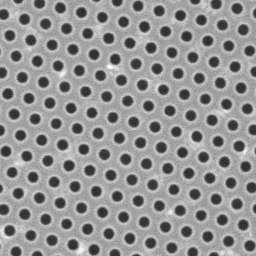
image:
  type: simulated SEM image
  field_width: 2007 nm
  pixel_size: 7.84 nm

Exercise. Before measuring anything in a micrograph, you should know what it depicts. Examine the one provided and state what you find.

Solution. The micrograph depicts a regular array of holes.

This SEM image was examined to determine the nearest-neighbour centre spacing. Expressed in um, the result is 0.168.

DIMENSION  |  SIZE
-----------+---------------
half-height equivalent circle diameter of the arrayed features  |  86.7 nm